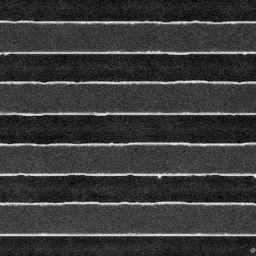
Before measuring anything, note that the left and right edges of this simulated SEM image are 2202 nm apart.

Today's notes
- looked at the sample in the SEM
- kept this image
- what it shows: lines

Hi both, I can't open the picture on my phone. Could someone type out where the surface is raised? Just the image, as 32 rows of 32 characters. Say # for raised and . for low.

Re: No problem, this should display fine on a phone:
................................
................................
................................
################################
################################
################################
################################
................................
................................
................................
################################
################################
################################
################################
................................
................................
................................
................................
################################
################################
################################
################################
................................
................................
................................
################################
################################
################################
################################
................................
................................
................................